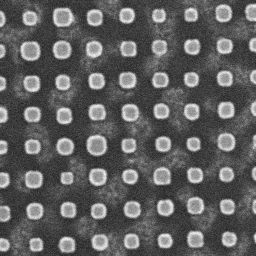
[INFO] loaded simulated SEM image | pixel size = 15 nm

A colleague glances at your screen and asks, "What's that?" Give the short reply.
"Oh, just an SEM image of a regular array of raised bodies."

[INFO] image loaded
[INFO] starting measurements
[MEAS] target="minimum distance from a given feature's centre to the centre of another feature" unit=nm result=468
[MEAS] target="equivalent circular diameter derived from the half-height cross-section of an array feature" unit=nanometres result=217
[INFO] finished